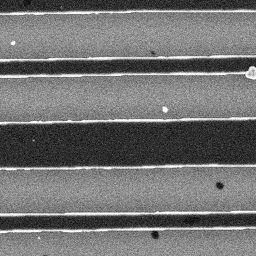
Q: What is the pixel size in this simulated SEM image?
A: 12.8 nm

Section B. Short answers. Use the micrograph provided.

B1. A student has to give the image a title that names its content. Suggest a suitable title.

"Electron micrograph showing lines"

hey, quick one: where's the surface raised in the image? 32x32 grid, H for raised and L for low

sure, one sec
HHHHHHHHHHHHHHHHHHHHHHHHHHHHHHHH
HHHHHHHHHHHHHHHHHLLLLLLLLLLLLLLL
LLLLLLLLLLLLLLLLLLLLLLLLLLLLLLLL
LLLLLLLLLLLLLLLLLLLLLLLLLLLLLLLL
LLLLLLLLLLLLLLLLLLLLLLLLLLLLLLLL
LLLLLLLLLLLLLLLLLLLLLLLLLLLLLLLL
LLLLLLLLLLLLLLLLLLLLLLLLLLLLLLLL
HHHHHHHHHHHHHHHHHHHHHHHHHHHHHHHH
HHHHHHHHHHHHHHHHHHHHHHHHHHHHHHHH
HHHHLLLLLLLLLLLLLLLLLLLLLLLLLLLH
LLLLLLLLLLLLLLLLLLLLLLLLLLLLLLLL
LLLLLLLLLLLLLLLLLLLLLLLLLLLLLLLL
LLLLLLLLLLLLLLLLLLLLLLLLLLLLLLLL
LLLLLLLLLLLLLLLLLLLLLLLLLLLLLLLL
LLLLLLLLLLLLLLLLLLLLLLLLLLLLLLLL
HHHHHHHHHHHHHHHHHHHHHHHHHHHHHHHH
HHHHHHHHHHHHHHHHHHHHHHHHHHHHHHHH
HHHHHHHHHHHHHHHHHHHHHHHHHHHHHHHH
HHHHHHHHHHHHHHHHHHHHHHHHHHHHHHHH
HHHHHHHHHHHHHHHHHHHHHHHHHHHHHHHH
HHHHHHHHHHHHHHHHHHHHHHHHHHHHHHHH
LLLLLLLLLLLLLLLLLLLLLLLLLLLLLLLL
LLLLLLLLLLLLLLLLLLLLLLLLLLLLLLLL
LLLLLLLLLLLLLLLLLLLLLLLLLLLLLLLL
LLLLLLLLLLLLLLLLLLLLLLLLLLLLLLLL
LLLLLLLLLLLLLLLLLLLLLLLLLLLLLLLL
LLLLLLLLLLLLLLLLLLLLLLLLLLLLLHHH
HHHHHHHHHHHHHHHHHHHHHHHHHHHHHHHH
HHHHHHHHHHHHHHHHHHHHHHHHHHHHHHLL
LLLLLLLLLLLLLLLLLLLLLLLLLLLLLLLL
LLLLLLLLLLLLLLLLLLLLLLLLLLLLLLLL
LLLLLLLLLLLLLLLLLLLLLLLLLLLLLLLL